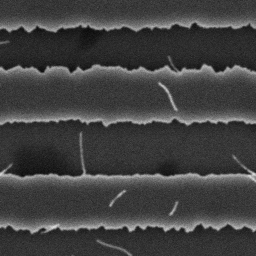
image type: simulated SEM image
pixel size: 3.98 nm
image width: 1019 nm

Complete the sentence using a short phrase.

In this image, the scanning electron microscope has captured lines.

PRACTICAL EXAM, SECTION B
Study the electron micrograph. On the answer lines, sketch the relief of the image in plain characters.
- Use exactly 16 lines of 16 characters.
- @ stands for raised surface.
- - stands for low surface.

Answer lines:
@@@@@@@@@@@@@@@@
@@@@@@@@@@@@@@@@
----------------
----------------
@@@@@@@@@@@@@@@@
@@@@@@@@@@@@@@@@
@@@@@@@@@@@@@@@@
@@@@-@@@@@@@@@@@
----------------
----------------
----------------
@@@@@@@@@@@@@@@@
@@@@@@@@@@@@@@@@
@@@@@@@@@@@@@@@@
----------------
----------------